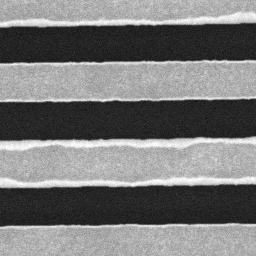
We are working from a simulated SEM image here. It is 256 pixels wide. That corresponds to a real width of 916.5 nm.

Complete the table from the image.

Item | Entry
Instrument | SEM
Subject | lines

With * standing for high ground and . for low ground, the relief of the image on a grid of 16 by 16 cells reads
****************
*******..*......
................
................
****************
****************
................
................
................
****************
****************
*********.......
................
................
****************
****************